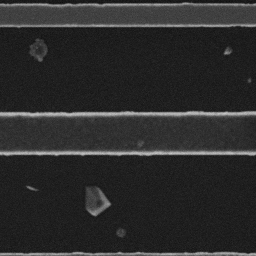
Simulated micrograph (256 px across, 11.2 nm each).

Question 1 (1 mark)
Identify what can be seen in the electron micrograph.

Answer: lines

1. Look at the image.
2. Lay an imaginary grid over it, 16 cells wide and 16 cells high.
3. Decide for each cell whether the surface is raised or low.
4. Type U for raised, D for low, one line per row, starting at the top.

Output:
UUUUUUUUUUUUUUUU
UUUUUUUUUUUUUUUU
DDDDDDDDDDDDDDDD
DDDDDDDDDDDDDDDD
DDDDDDDDDDDDDDDD
DDDDDDDDDDDDDDDD
DDDDDDDDDDDDDDDD
UUUUUUUUUUUUUUUU
UUUUUUUUUUUUUUUU
UUUUUUUUUUUUUUUU
DDDDDDDDDDDDDDDD
DDDDDDDDDDDDDDDD
DDDDDDDDDDDDDDDD
DDDDDDDDDDDDDDDD
DDDDDDDDDDDDDDDD
DDDDDDDDDDDDDDDD